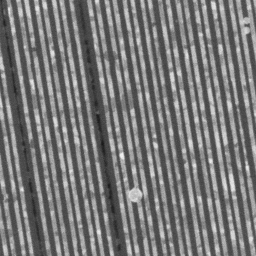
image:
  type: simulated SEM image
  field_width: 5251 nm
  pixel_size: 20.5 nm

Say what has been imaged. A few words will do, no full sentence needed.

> parallel lines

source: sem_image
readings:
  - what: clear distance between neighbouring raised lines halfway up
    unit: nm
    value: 109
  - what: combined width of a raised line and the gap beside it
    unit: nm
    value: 179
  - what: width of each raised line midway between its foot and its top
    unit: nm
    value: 68.4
